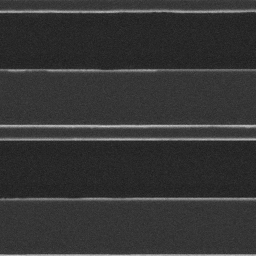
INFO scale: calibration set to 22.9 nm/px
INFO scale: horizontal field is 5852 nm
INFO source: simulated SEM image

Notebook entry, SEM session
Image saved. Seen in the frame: lines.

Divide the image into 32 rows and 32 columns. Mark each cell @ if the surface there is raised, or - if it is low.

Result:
@@@@@@@@@@@@@@@@@@@@@@@@@@@@@@@@
-----------@@@------------------
--------------------------------
--------------------------------
--------------------------------
--------------------------------
--------------------------------
--------------------------------
--------------------------------
@@@@@@@@@@@@@@@@@@@@@@@@@@@@@@@@
@@@@@@@@@@@@@@@@@@@@@@@@@@@@@@@@
@@@@@@@@@@@@@@@@@@@@@@@@@@@@@@@@
@@@@@@@@@@@@@@@@@@@@@@@@@@@@@@@@
@@@@@@@@@@@@@@@@@@@@@@@@@@@@@@@@
@@@@@@@@@@@@@@@@@@@@@@@@@@@@@@@@
@@@@@@@@@@@@@@@@@@@@@@@@@@@@@@@@
@@@@@@@@@@@@@@@@@@@@@@@@@@@@@@@@
--------------------------------
--------------------------------
--------------------------------
--------------------------------
--------------------------------
--------------------------------
--------------------------------
--------------------------------
@@@@@@@@@@@@@@@@@@@@@@@@@@@@@@@@
@@@@@@@@@@@@@@@@@@@@@@@@@@@@@@@@
@@@@@@@@@@@@@@@@@@@@@@@@@@@@@@@@
@@@@@@@@@@@@@@@@@@@@@@@@@@@@@@@@
@@@@@@@@@@@@@@@@@@@@@@@@@@@@@@@@
@@@@@@@@@@@@@@@@@@@@@@@@@@@@@@@@
@@@@@@@@@@@@@@@@@@@@@@@@@@@@@@@@